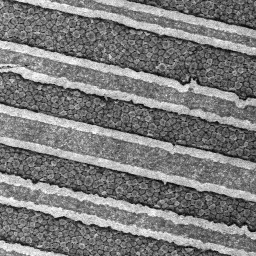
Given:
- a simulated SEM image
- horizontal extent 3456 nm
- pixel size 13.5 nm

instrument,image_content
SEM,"one or a few lines or trenches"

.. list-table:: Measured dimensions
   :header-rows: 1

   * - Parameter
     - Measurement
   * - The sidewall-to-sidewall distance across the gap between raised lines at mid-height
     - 0.529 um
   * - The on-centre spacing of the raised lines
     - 65.6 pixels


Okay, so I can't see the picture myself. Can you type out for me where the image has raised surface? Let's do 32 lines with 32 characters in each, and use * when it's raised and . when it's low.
......**********................
...........*********............
...............*********........
...................**********...
........................********
............................****
****............................
*********.......................
*************...................
....**************..............
........**************..........
.............*************......
.................*************..
......................**********
****......................******
*********.....................**
*************...................
******************..............
.....****************...........
.........*****************......
.............*****************..
..................**************
**....................**********
******.....................*****
**********.....................*
..*************.................
......*************.............
............**********.*........
................************....
....................************
.........................*******
****.........................***